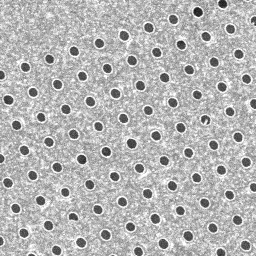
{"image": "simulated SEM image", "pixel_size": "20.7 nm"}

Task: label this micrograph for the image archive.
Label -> a regular array of holes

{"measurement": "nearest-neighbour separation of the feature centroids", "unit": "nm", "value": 535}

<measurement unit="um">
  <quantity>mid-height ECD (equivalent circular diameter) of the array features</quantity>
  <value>0.207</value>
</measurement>